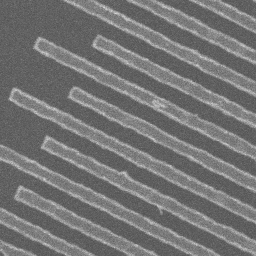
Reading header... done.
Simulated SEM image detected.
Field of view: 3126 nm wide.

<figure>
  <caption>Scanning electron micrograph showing parallel lines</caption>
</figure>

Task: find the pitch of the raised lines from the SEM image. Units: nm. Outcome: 347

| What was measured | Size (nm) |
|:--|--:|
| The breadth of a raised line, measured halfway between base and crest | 166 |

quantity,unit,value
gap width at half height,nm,190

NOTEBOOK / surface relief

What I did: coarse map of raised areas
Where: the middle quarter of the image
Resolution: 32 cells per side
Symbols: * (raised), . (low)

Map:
.*******.........*******........
...*******.........*******......
.....*******.........*******....
.......*******........********..
.........*******........********
...........********........*****
..**.........*******.........***
.*****.........*******.........*
..******.........*******........
...********........*******......
.....********........*******....
.......*******.........*******..
*........*******.........*******
**.........*******.........*****
****.........********........***
******.........********........*
..******..........******........
....******.........*******......
......******.........*******....
.......*******.........*******..
.........*******.........*******
***.........******.........*****
****..........*******........***
*******........*******.........*
..******.........********.......
...*******........*********.....
......*******........*******....
.......*********.......*******..
.........********........*******
**.........*******.........*****
*****........********........***
*******........********........*